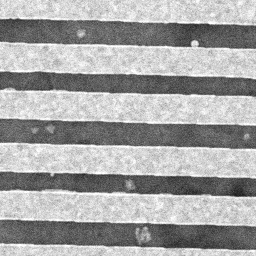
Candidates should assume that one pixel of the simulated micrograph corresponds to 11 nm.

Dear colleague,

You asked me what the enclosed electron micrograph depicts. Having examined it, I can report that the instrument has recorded lines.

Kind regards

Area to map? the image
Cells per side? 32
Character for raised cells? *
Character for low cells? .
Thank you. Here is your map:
********************************
********************************
............********************
................................
................................
***.............................
********************************
********************************
********************************
............................****
................................
******..........................
********************************
********************************
********************************
..............................**
................................
................................
*************************.......
********************************
********************************
......**************************
................................
................................
*************************.......
********************************
********************************
.......*************************
................................
................................
................................
********************************